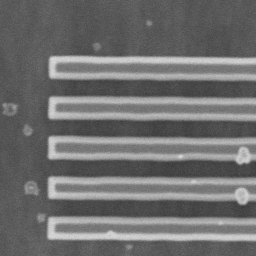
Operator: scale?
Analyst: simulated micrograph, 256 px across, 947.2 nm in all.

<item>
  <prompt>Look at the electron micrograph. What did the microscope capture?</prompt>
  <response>groups of lines, slits or small figures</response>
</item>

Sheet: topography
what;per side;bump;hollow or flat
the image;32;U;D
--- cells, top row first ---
DDDDDDDDDDDDDDDDDDDDDDDDDDDDDDDD
DDDDDDDDDDDDDDDDDDDDDDDDDDDDDDDD
DDDDDDDDDDDDDDDDDDDDDDDDDDDDDDDD
DDDDDDDDDDDDDDDDDDDDDDDDDDDDDDDD
DDDDDDDDDDDDDDDDDDDDDDDDDDDDDDDD
DDDDDDDDDDDDDDDDDDDDDDDDDDDDDDDD
DDDDDDDDDDDDDDDDDDDDDDDDDDDDDDDD
DDDDDDDUUUUUUUUUUUUDUUDDDDDDDDDD
DDDDDDDUUUUUUUUUUUUUUUUUUUUUUUUU
DDDDDDDUUUUUUUUUUUUUUUUUUUUUUUUU
DDDDDDDDDDDDDDDDDDDDDDDDDDDDDDDD
DDDDDDDDDDDDDDDDDDDDDDDDDDDDDDDD
DDDDDDDUUUUUUUUUUUUUUUUDDDDDDDDD
DDDDDDUUUUUUUUUUUUUUUUUUUUUUUUUU
DDDDDDDUUUUUUUUUUUUUUUUUUUUUUUUU
DDDDDDDDDDDDDDDDDDDDDDDDDDDDDDDD
DDDDDDDDDDDDDDDDDDDDDDDDDDDDDDDD
DDDDDDDUUUUUUUUUUDDDDDDDDDDDDDDD
DDDDDDUUUUUUUUUUUUUUUUUUUUUUUUUU
DDDDDDDUUUUUUUUUUUUUUUUUUUUUUUUU
DDDDDDDDDDDDDDDDDDDDDDDDDDDDDDDD
DDDDDDDDDDDDDDDDDDDDDDDDDDDDDDDD
DDDDDDDUUUDDUUUUUDUUUDDDDDDDDDDD
DDDDDDUUUUUUUUUUUUUUUUUUUUUUUUUU
DDDDDDDUUUUUUUUUUUUUUUUUUUUUUUUU
DDDDDDDDDDDDDDDDDDDDDDDDDDDDDDUD
DDDDDDDDDDDDDDDDDDDDDDDDDDDDDDDD
DDDDDDDUUUUUUUUUDDDUUUDDDDDDDDDD
DDDDDDUUUUUUUUUUUUUUUUUUUUUUUUUU
DDDDDDDUUUUUUUUUUUUUUUUUUUUUUUUU
DDDDDDDDDDDDDDDDDDDDDDDDDDDDDDDD
DDDDDDDDDDDDDDDDDDDDDDDDDDDDDDDD